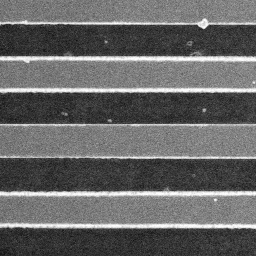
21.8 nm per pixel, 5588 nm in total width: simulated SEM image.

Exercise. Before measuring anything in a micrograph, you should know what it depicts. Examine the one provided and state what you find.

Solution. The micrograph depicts lines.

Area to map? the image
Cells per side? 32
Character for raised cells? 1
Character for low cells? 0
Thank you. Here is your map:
11111111111111111111111111111111
11111111111111111111111111111111
11111111111111111111111111111111
00000000000000000000000000000000
00000000000000000000000000000000
00000000000000000000000000000000
00000000000000000000000000000000
11111111111111111111111111111111
11111111111111111111111111111111
11111111111111111111111111111111
11111111111111111111111111111111
00000000000000000000000000000000
00000000000000000000000000000000
00000000000000000000000000000000
00000000000000000000000000000000
00000000000000000000000000000000
11111111111111111111111111111111
11111111111111111111111111111111
11111111111111111111111111111111
11111111111111111111111111111111
00000000000000000000000000000000
00000000000000000000000000000000
00000000000000000000000000000000
00000000000000000000000000000000
11111111111111111111111111111111
11111111111111111111111111111111
11111111111111111111111111111111
11111111111111111111111111111111
00000000000000000000000000000000
00000000000000000000000000000000
00000000000000000000000000000000
00000000000000000000000000000000